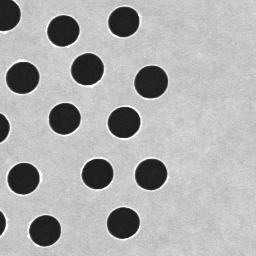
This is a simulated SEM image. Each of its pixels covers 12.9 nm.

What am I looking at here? a regular array of holes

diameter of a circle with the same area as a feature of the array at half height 0.411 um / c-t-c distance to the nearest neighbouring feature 0.699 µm